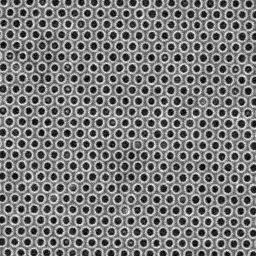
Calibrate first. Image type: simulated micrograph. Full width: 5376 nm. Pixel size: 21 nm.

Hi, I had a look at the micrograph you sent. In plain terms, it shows a regular array of holes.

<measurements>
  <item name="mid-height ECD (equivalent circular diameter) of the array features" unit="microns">0.168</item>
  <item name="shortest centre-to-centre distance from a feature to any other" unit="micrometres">0.26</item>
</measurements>